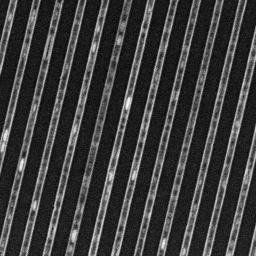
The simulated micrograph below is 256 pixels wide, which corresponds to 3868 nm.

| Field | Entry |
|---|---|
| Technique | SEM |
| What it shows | parallel lines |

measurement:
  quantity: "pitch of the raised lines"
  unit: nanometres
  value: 337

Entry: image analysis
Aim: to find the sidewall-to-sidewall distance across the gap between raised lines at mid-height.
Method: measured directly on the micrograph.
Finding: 234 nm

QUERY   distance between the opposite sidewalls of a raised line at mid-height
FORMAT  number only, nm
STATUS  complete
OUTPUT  103